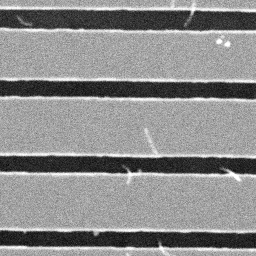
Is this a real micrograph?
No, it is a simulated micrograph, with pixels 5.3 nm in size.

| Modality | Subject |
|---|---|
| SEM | lines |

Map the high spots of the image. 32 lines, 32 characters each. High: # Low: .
################################
................................
................................
................................
################################
################################
################################
################################
################################
################################
................................
................................
###############################.
################################
################################
################################
################################
################################
################################
............####################
................................
................................
################################
################################
################################
################################
################################
################################
################################
................................
................................
################################